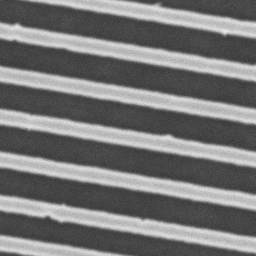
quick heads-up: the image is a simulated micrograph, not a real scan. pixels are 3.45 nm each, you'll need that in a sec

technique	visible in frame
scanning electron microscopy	parallel lines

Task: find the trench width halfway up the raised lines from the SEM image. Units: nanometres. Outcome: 100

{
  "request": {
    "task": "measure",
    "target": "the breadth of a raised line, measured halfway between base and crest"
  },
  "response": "0.0443 um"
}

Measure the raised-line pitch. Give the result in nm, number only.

146